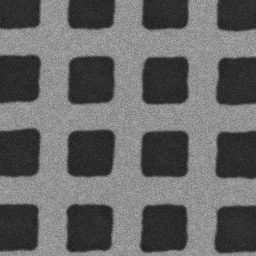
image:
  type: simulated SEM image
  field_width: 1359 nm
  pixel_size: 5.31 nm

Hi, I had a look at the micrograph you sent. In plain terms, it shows holes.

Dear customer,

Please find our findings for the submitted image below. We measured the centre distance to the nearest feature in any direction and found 390 nm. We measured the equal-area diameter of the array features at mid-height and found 272 nm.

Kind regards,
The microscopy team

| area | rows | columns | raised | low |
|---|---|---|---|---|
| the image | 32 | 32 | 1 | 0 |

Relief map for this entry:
00000111100000111100000111100000
00000111000000111100000111100000
00000111000000111100000111100000
00011111100001111100000111100000
11111111111111111111111111111111
11111111111111111111111111111111
11111111111111111111111111111111
00000111100000111100000111110000
00000111100000111100000011100000
00000111100000111100000011100000
00000111100000111100000111100000
00000111100000111100000011100000
00001111100000111100000111100000
11111111111111111111111111111111
11111111111111111111111111111111
11111111111111111111111111111111
00000111100000111110000111111100
00000111000000111100000011100000
00000111000000111100000011100000
00000111000000111100000011100000
00000111000000111100000111100000
00000111100000111100000111100000
11111111111111111111111111111111
11111111111111111111111111111111
11111111111111111111111111111111
01111111111111111111111111111111
00000111000000111100000111100000
00000111000000111100000111100000
00000111000000111100000111100000
00000111000000111100000111100000
00000111000000111100000111100000
11111111100111111100111111100111